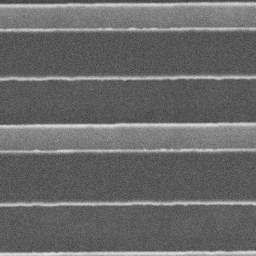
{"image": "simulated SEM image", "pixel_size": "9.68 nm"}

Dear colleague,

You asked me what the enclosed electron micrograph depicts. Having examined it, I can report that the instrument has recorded lines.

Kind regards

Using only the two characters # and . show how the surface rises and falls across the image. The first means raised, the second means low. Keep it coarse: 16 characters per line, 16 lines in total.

################
################
################
################
################
................
................
................
################
################
################
################
################
................
................
................